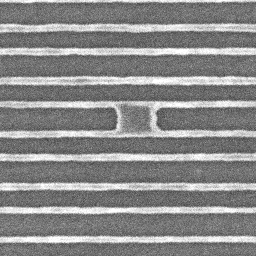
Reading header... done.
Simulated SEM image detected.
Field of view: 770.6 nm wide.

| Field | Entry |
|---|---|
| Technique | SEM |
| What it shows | parallel lines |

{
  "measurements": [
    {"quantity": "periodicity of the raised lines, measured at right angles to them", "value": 79.6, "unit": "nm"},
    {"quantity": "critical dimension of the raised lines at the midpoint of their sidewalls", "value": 0.0166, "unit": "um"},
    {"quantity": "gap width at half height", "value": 0.0666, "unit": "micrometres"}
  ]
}